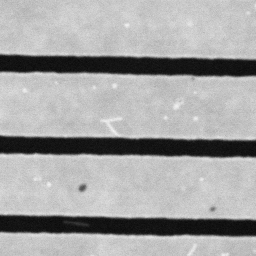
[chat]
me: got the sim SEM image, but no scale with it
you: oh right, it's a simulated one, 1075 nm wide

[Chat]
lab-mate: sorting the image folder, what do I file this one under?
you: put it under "lines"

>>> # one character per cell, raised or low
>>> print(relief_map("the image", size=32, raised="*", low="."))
********************************
********************************
********************************
********************************
********************************
********************************
********************************
................................
................................
************************........
********************************
********************************
********************************
********************************
********************************
********************************
********************************
................................
................................
*********************.**........
********************************
********************************
********************************
********************************
********************************
********************************
********************************
................................
................................
********************.******.....
********************************
********************************